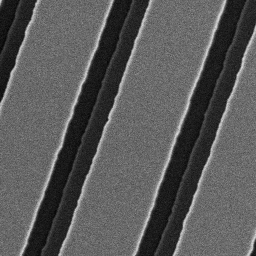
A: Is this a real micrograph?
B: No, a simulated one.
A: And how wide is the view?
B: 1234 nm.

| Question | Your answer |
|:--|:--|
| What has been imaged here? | lines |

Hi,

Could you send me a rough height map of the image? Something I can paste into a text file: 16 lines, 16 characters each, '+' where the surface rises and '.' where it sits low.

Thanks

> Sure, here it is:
..+++++..+++++..
..+++++..+++++..
.+++++..+++++...
.+++++..+++++..+
.++++...+++++..+
+++++..+++++...+
+++++..+++++..++
++++...++++...++
++++..+++++..+++
++++..+++++..+++
+++...++++...+++
+++..+++++..++++
+++..+++++..++++
++...++++...++++
++..+++++..+++++
++..+++++..+++++